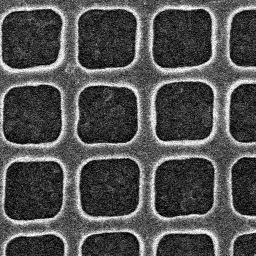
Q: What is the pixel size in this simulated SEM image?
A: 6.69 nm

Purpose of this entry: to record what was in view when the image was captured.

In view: a regular array of holes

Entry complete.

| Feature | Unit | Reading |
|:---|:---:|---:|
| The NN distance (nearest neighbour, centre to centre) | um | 0.499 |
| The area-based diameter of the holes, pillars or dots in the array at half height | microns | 0.433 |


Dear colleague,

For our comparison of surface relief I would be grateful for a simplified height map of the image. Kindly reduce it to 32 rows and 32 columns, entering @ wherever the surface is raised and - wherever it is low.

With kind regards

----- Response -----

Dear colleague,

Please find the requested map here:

@@@@@@@@@@@@@@@@@@@@@@@@@@@@@@@@
@------@@@@-----@@@@------@@@@--
--------@@-------@@-------@@@---
--------@@-------@@--------@@---
--------@@-------@@-------@@@---
--------@@-------@@-------@@@---
--------@@-------@@--------@@---
-------@@@-------@@-------@@@---
@----@@@@@@---@@@@@@---@@@@@@@@@
@@@@@@@@@@@@@@@@@@@@@@@@@@@@@@@@
@@@@@@@@@@@@@@@@@@@@@-----@@@@--
@------@@@-------@@--------@@---
@-------@@-------@@--------@@---
--------@@-------@@--------@@---
--------@@-------@@--------@@---
--------@@-------@@--------@@---
--------@@-------@@-------@@@---
@------@@@------@@@@-----@@@@---
@@@@@@@@@@@@@@@@@@@@@@@@@@@@@@@@
@@@@@@@@@@@@@@@@@@@@@@@@@@@@@@@@
@------@@@@------@@@------@@@---
@-------@@--------@--------@@---
@-------@@--------@--------@@---
@-------@@-------@@--------@@---
@-------@@-------@@--------@@---
--------@@-------@@--------@@---
@------@@@-------@@-------@@@@--
@@--@@@@@@@@@@@@@@@@@@@@@@@@@@@@
@@@@@@@@@@@@@@@@@@@@@@@@@@@@@@@@
@@@@---@@@@------@@@------@@@@--
@-------@@-------@@@-------@@---
@-------@@--------@--------@@---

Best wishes